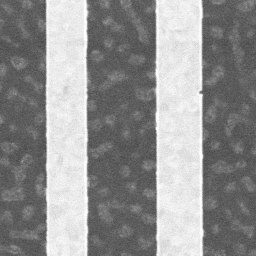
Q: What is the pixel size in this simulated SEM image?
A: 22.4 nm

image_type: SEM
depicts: one or a few lines or trenches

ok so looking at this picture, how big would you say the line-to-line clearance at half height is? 1590 nm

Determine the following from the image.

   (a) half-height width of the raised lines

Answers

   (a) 0.88 micrometres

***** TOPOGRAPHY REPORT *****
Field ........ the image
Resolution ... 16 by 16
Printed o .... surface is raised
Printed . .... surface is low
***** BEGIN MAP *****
...oo.....ooo...
...oo.....ooo...
...oo.....ooo...
...oo.....ooo...
...oo.....ooo...
...oo.....ooo...
...oo.....ooo...
...oo.....ooo...
...oo.....ooo...
...oo.....ooo...
...oo.....ooo...
...oo.....ooo...
...oo.....ooo...
...oo.....ooo...
...oo.....ooo...
...oo.....ooo...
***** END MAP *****